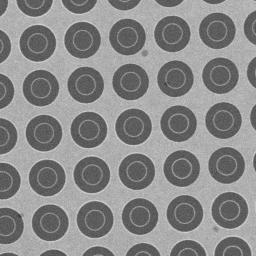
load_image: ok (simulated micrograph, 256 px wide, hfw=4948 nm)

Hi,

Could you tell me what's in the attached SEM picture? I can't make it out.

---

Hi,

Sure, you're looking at an array of small figures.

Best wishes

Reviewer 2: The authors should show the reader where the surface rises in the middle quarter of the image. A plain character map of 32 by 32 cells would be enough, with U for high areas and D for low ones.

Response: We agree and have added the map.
UUUUUUUUUUUUUUDDDDDUUUUUUDDDDDDU
UUUDDDDDUUUUUDDDDDDDUUUUDDDUUDDD
UUDDDDDDDUUUUDDUUUDDDUUDDDUUUUDD
UDDDUUUDDDUUDDUUUUUDDUUDDDUUUUDD
UDDUUUUUDDUUDDUUUUUDDUUDDDUUUUDD
UDDUUUUUDDUUDDUUUUUDDUUUDDUUUUDD
UDDUUUUUDDUUDDDUUUDDDUUUDDDDDDDU
UDDDDUUDDDUUUDDDDDDDUUUUUDDDDDUU
UUDDDDDDDUUUUUDDDDDUUUUUUUUUUUUU
UUUDDDDUUUUUUUUUUUUUUUUUUUUUUUUU
UUUUUUUUUUUUUUUUUUUUUUUUUUUDDDUU
UUUUUUUUUUUUUUUDDDDUUUUUUUDDDDDD
UUUUDDDDDUUUUUDDDDDDDUUUUDDDDDDD
UUUDDDDDDDUUUDDDUUUDDDUUDDDUUUUD
UUDDDUUUDDUUUDDUUUUUDDUUDDUUUUUD
UUDDUUUUDDDUUDDUUUUUDDUUDDUUUUUD
UDDDUUUUUDDUUDDUUUUUDDUUDDDUUUDD
UUDDUUUUUDDUUDDDUUUDDDUUUDDDDDDD
UUDDDUUUDDUUUUDDDDDDDUUUUUDDDDDD
UUUDDDDDDDUUUUDDDDDDUUUUUUUUDUUU
UUUUDDDDDUUUUUUUUUUUUUUUUUUUUUUU
UUUUUUUUUUUUUUUUUUUUUUUUUUUUUDUU
UUUUUUUUUUUUUUUUUDDDUUUUUUUDDDDD
UUUUUDDDDUUUUUUDDDDDDUUUUUDDDDDD
UUUUDDDDDDUUUUDDDDUDDDUUUDDDUUUD
UUUDDDUUDDDUUUDDUUUUDDDUUDDUUUUU
UUDDDUUUUDDDUUDDUUUUUDDUUDDUUUUU
DUDDDUUUUUDDUUDDUUUUUDDUUDDUUUUD
DUDDDUUUUDDDUUDDUUUUDDDUUDDDDUDD
UUUDDUUUUDDUUUDDDDDDDDUUUUDDDDDD
UUUDDDDDDDDUUUUDDDDDDUUUUUUUDDDU
UUUUDDDDDDUUUUUUUDDUUUUUUUUUUUUU